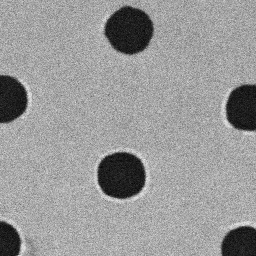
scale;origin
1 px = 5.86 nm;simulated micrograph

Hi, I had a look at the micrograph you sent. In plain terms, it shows holes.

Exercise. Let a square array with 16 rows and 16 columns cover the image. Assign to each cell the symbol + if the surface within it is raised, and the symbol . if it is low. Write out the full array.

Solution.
++++++++++++++++
+++++++...++++++
+++++++..+++++++
++++++++++++++++
++++++++++++++++
..+++++++++++++.
..++++++++++++..
.+++++++++++++..
++++++++++++++++
++++++++++++++++
++++++...+++++++
++++++...+++++++
++++++++++++++++
++++++++++++++++
.+++++++++++++..
.+++++++++++++..